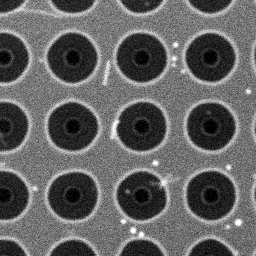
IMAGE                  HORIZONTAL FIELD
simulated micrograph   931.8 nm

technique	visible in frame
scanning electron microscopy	an array of small figures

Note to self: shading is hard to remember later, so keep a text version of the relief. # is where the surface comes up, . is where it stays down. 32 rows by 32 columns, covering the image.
...####.....###.....####.....###
.#######..######...######..#####
################################
################################
..#####....#####...######...####
...###......###.....####.....###
#...##..##..###..##..##...#..###
##..##..##..###..##..##..##..###
...###......###......##......###
...####....#####....####....####
################################
################################
################################
...####....#####....####....####
...###......###......##......###
##..##..##..###..##..##..##..###
#..###..##..###..##..##..##..###
...###......###.....####.....###
..#####....#####...######...####
################################
################################
.########.#######..######...####
...####.....###.....####.....###
#...##...#..###..#...##...#..###
##..##..##..###..##..##..##...##
#...##...#..###..#...##...#..###
...####.....###.....####.....###
.#######..#######..#######.#####
################################
################################
..#####....#####....#####...####
...###......###.....####.....###